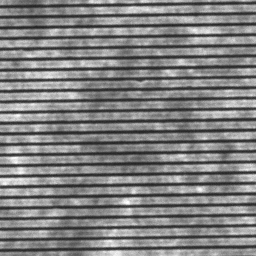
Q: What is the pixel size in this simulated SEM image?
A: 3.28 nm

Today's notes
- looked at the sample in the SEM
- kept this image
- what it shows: parallel lines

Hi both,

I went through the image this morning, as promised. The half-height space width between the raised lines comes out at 11.9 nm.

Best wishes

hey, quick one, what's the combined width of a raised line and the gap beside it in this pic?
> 34.8 nm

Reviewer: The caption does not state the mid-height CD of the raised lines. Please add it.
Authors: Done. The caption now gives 23.2 nm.